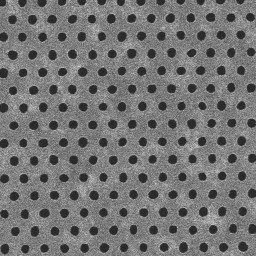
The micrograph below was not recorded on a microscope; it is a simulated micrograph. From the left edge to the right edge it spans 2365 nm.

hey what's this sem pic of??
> a regular array of holes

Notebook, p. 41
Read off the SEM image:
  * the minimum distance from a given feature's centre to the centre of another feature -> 180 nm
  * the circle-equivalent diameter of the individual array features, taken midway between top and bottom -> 82.1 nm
